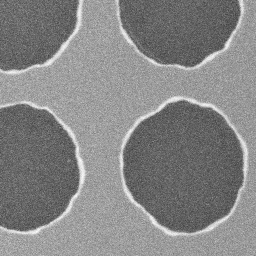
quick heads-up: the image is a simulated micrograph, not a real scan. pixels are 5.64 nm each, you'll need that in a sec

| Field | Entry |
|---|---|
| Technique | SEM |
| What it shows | holes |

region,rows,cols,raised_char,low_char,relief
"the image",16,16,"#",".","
.....##........#
.....###.......#
....####......##
...######....###
################
################
#.########..####
....#####.....##
....####.......#
.....###.......#
.....###.......#
.....###.......#
....####.......#
....#####.....##
#.#########.####
################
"